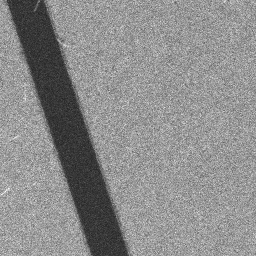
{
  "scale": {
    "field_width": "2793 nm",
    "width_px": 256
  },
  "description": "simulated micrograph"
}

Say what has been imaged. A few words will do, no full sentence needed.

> one or a few lines or trenches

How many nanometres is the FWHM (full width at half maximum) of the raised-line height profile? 415